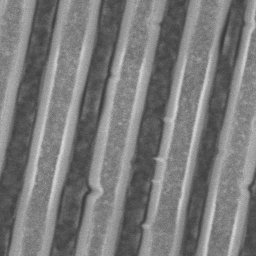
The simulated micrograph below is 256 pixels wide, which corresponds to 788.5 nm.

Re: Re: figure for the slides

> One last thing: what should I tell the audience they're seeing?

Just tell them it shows one or a few lines or trenches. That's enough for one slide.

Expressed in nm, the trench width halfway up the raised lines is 92.5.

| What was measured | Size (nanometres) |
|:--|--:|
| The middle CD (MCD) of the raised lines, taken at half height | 100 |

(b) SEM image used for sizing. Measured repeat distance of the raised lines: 62.3 px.